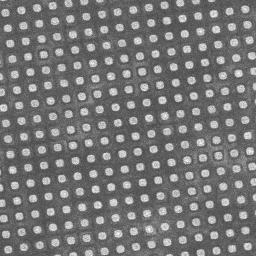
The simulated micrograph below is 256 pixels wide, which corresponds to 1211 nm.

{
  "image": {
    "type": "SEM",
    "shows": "a regular array of raised bodies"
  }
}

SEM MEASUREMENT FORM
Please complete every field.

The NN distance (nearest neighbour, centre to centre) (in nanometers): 73.6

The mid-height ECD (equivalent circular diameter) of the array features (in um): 0.0374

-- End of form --